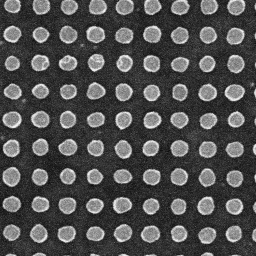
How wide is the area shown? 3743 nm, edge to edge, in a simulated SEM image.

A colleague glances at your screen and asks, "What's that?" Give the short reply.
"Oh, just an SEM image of a regular array of raised bodies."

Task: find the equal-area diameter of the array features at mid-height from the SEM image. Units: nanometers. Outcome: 235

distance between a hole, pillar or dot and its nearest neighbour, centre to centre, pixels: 27.3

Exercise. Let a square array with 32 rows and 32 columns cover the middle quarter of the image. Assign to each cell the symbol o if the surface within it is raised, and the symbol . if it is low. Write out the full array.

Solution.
ooo...oooo....ooo...oooo...oooo.
oo............oo.....oo.....oo..
................................
................................
................................
oo.....oo....ooo.....oo.....oo..
ooo...oooo...oooo...oooo...oooo.
ooo...oooo...oooo...oooo...oooo.
oo....oo......oo....ooo....ooo..
................................
................................
................................
oo.....oo.....oo.....oo....ooo..
ooo...oooo...oooo...oooo...oooo.
ooo...oooo...oooo...oooo...oooo.
oo.....o.....ooo....ooo.....oo..
................................
................................
................................
oo.....oo.....o......oo....ooo..
ooo...oooo...oooo...oooo...oooo.
ooo...oooo...oooo...oooo...oooo.
oo.....oo....ooo....ooo....ooo..
................................
................................
................................
oo.....o......o......o......oo..
ooo...ooo....oooo...oooo...oooo.
ooo...ooo...ooooo...oooo...oooo.
oo.....oo....ooo....ooo....ooo..
................................
................................